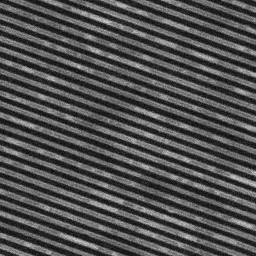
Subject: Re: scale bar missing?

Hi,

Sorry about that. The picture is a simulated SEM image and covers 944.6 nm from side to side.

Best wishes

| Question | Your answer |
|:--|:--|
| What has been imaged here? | parallel lines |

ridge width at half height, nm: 16.5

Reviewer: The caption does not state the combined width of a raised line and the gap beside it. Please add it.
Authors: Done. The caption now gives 37.9 nm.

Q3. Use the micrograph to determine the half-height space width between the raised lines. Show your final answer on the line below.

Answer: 23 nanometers